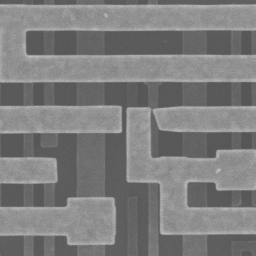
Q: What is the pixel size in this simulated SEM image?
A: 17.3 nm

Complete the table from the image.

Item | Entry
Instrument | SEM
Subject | wiring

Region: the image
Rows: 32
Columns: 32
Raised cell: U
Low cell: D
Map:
DDDDDDDDDDDDDDDDDDDDDDDDDDDDDDDD
UUUUUUUUUUUUUUUUUUUUUUUUUUUUUUUU
UUUUUUUUUUUUUUUUUUUUUUUUUUUUUUUU
UUUUUUUUUUUUUUUUUUUUUUUUUUUUUUUU
UUUDDDDDDDDDDDDDDDDDDDDDDDDDDDDD
UUUDDDDDDDDDDDDDDDDDDDDDDDDDDDDD
UUUDDDDDDDDDDDDDDDDDDDDDDDDDDDDD
UUUUUUUUUUUUUUUUUUUUUUUUUUUUUUUU
UUUUUUUUUUUUUUUUUUUUUUUUUUUUUUUU
UUUUUUUUUUUUUUUUUUUUUUUUUUUUUUUU
DDDDDDDDDDDDDDDDDDDDDDDDDDDDDDDD
DDDDDDDDDDDDDDDDDDDDDDDDDDDDDDDD
DDDDDDDDDDDDDDDDDDDDDDDDDDDDDDDD
UUUUUUUUUUUUUUUDDUDDDUUUUUUUUUUU
UUUUUUUUUUUUUUUDUUUUUUUUUUUUUUUU
UUUUUUUUUUUUUUUDUUUDUUUUUUUUUUUU
UUUUUUUUUUUUUUUDUUUDDDDDDDDDDDDD
DDDDDDDDDDDDDDDDUUUDDDDDDDDDDDDD
DDDDDDDDDDDDDDDDUUUDDDDDDDDDDDDD
DDDDDDDDDDDDDDDDUUUDDDDDDDDUUUUU
UUUUUUUDDDDDDDDDUUUUUUUUUUUUUUUU
UUUUUUUDDDDDDDDDUUUUUUUUUUUUUUUU
UUUUUUUDDDDDDDDDUUUUUUUUUUUUUUUU
DDDDDDDDDDDDDDDDDDDDUUUDDDDUUUUU
DDDDDDDDDDDDDDDDDDDDUUUDDDDDDDDD
DDDDDDDDUUUUUUDDDDDDUUUUDDDDDDDD
UUUUUUUUUUUUUUDDDDDDUUUUUUUUUUUU
UUUUUUUUUUUUUUDDDDDDUUUUUUUUUUUU
UUUUUUUUUUUUUUDDDDDDUUUUUUUUUUUU
DDDDDDDDUUUUUUDDDDDDDDDDDDDDDDDD
DDDDDDDDDUUUDDDDDDDDDDDDDDDDDDDD
DDDDDDDDDDDDDDDDDDDDDDDDDDDDDDDD